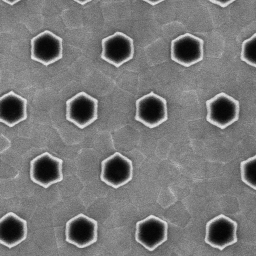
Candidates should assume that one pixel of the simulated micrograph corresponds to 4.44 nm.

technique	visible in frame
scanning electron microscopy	a regular array of raised bodies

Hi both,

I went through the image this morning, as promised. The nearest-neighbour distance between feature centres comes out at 310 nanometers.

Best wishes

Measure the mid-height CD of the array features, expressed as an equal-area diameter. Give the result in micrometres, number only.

0.138